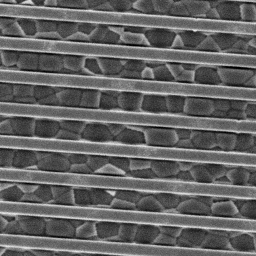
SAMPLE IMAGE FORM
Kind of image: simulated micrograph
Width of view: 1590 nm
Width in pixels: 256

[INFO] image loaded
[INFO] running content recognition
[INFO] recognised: parallel lines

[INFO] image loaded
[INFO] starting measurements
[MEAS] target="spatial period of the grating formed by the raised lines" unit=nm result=203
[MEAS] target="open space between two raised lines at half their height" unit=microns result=0.129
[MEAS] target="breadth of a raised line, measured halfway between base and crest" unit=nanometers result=70.4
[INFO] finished